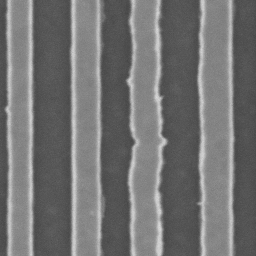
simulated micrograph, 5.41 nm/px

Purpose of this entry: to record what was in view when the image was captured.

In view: one or a few lines or trenches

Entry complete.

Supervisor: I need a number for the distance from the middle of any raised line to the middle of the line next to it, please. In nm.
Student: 354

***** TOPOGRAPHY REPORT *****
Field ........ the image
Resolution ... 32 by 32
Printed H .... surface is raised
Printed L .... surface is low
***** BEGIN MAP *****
LHHHLLLLLHHHLLLLLHHHLLLLLHHHHLLL
LHHHLLLLLHHHLLLLLHHHLLLLLHHHHLLL
LHHHLLLLLHHHLLLLHHHHLLLLLHHHHLLL
LHHHLLLLLHHHLLLLLHHHLLLLLHHHHLLL
LHHHLLLLLHHHLLLLLHHHLLLLLHHHHLLL
LHHHLLLLLHHHLLLLLHHHLLLLLHHHHLLL
LHHHLLLLLHHHLLLLLHHHLLLLLHHHHLLL
LHHHLLLLLHHHLLLLLHHHLLLLLHHHHLLL
LHHHLLLLLHHHLLLLHHHHLLLLLHHHHLLL
LHHHLLLLLHHHLLLLHHHHLLLLLHHHHLLL
LHHHLLLLLHHHLLLLHHHHLLLLLHHHHLLL
LHHHLLLLLHHHLLLLHHHHLLLLLHHHHLLL
LHHHLLLLLHHHLLLLHHHHLLLLLHHHHLLL
LHHHLLLLLHHHLLLLHHHHLLLLLHHHHLLL
LHHHLLLLLHHHLLLLHHHHLLLLLHHHHLLL
LHHHLLLLLHHHLLLLHHHHLLLLLHHHHLLL
LHHHLLLLLHHHLLLLLHHHLLLLLHHHHLLL
LHHHLLLLLHHHLLLLLHHHHLLLLHHHHLLL
LHHHLLLLLHHHLLLLLHHHLLLLLHHHHLLL
LHHHLLLLLHHHLLLLLHHHLLLLLHHHHLLL
LHHHLLLLLHHHLLLLHHHHLLLLLHHHHLLL
LHHHLLLLLHHHLLLLHHHHLLLLLHHHHLLL
LHHHLLLLLHHHLLLLHHHHLLLLLHHHHLLL
LHHHLLLLLHHHLLLLHHHHLLLLLHHHHLLL
LHHHLLLLLHHHLLLLHHHHLLLLLHHHHLLL
LHHHLLLLLHHHLLLLHHHHLLLLLHHHHLLL
LHHHLLLLLHHHLLLLLHHHLLLLLHHHHLLL
LHHHLLLLLHHHLLLLLHHHLLLLLHHHHLLL
LHHHLLLLLHHHLLLLLHHHLLLLLHHHHLLL
LHHHLLLLLHHHLLLLLHHHLLLLLHHHHLLL
LHHHLLLLLHHHLLLLLHHHLLLLLHHHHLLL
LHHHLLLLLHHHLLLLLHHHLLLLLHHHHLLL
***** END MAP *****